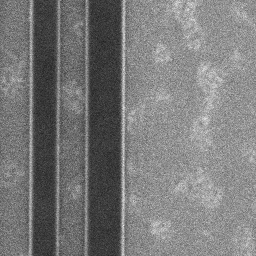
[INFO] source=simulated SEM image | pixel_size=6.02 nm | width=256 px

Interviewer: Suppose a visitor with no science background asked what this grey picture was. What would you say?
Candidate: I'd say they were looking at parallel lines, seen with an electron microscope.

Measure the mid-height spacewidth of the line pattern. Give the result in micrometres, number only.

0.161